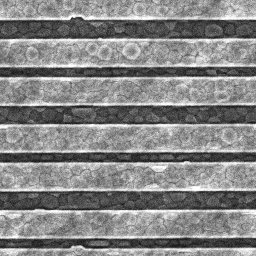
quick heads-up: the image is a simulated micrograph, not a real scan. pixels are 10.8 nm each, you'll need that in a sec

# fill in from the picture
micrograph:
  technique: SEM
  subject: parallel lines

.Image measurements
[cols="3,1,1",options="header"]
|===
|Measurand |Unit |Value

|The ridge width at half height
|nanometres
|299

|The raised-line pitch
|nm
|464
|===